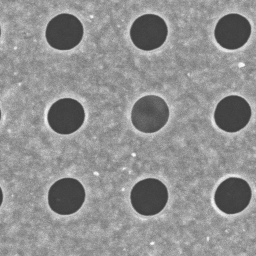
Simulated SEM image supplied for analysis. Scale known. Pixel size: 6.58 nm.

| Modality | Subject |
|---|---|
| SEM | a regular array of holes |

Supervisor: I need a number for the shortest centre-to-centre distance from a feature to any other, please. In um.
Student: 0.539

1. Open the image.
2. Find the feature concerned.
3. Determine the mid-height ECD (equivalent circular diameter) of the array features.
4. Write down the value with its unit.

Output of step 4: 246 nanometers